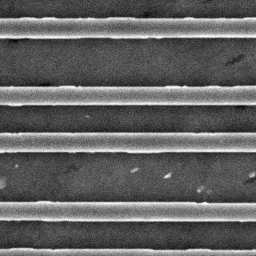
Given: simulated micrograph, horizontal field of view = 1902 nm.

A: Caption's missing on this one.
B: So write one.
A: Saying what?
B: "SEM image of lines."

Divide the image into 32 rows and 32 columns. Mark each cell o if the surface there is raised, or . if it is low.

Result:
................................
................................
oooooooooooooooooooooooooooooooo
oooooooooooooooooooooooooooooooo
ooooooooooooooooooooooooooo.oooo
................................
................................
................................
................................
................................
................................
oooooooooooooooooooooooooooooooo
oooooooooooooooooooooooooooooooo
................................
................................
................................
................................
oooooooooooooooooooooooooooooooo
oooooooooooooooooooooooooooooooo
................................
................................
................................
................................
................................
................................
oooooooooooooooooooooooooooooooo
oooooooooooooooooooooooooooooooo
.....oo.oooooooooooooooooooooooo
................................
................................
................................
oooooooooooooooooooooooooooooooo